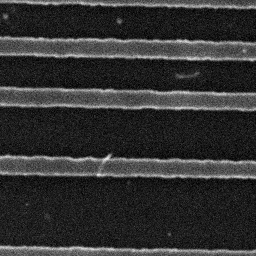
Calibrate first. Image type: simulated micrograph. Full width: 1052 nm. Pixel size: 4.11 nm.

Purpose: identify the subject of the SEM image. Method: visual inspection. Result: lines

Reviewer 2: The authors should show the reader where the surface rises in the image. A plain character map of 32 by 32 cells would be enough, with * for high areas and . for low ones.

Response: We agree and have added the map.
...........*********************
................................
................................
................................
................................
********************************
********************************
...............................*
................................
................................
................................
********************.***........
********************************
...............***.*************
................................
................................
................................
................................
................................
**..............................
********************************
********************************
................................
................................
................................
................................
................................
................................
................................
................................
................................
********************************